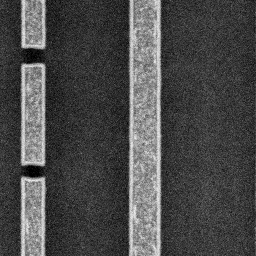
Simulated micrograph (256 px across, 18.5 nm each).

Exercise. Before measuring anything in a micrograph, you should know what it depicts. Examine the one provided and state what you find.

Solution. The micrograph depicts one or a few lines or trenches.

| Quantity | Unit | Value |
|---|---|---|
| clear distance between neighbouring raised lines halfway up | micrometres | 1.61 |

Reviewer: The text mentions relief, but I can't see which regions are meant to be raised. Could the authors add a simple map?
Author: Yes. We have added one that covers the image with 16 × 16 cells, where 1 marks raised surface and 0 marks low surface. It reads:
0110000011000000
0110000011000000
0110000011000000
0000000011000000
0110000011000000
0110000011000000
0110000011000000
0110000011000000
0110000011000000
0110000011000000
0000000011000000
0010000011000000
0110000011000000
0110000011000000
0110000011000000
0110000011000000